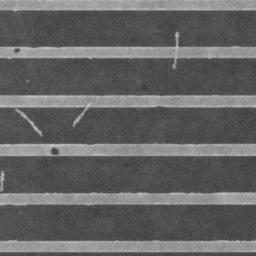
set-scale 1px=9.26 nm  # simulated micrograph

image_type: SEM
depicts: lines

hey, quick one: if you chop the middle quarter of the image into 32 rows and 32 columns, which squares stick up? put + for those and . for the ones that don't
................................
................................
................................
................................
................................
................................
................................
................................
++++++++++++++++++++++++++++++++
++++++++++++++++++++++++++++++++
++++++++++++++++++++++...+++++++
................................
................................
................................
................................
................................
................................
................................
................................
................................
++++++++++++++++++++++++++++++++
++++++++++++++++++++++++++++++++
++++++++++++++++++++++++++++++++
................................
................................
................................
................................
................................
................................
................................
................................
................................